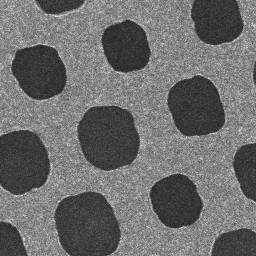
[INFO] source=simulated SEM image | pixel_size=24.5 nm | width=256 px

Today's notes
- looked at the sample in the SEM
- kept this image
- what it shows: holes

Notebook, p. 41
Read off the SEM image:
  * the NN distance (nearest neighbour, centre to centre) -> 92.3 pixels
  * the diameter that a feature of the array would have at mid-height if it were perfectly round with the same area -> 1340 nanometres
